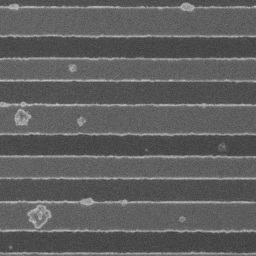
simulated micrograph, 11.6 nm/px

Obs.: lines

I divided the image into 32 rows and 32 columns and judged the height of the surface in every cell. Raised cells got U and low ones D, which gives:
DDDDDDDDDDDDDDDDDDDDDDDUDDDDDDDD
UUUUUUUUUUUUUUUUUUUUUUUUUUUUUUUU
UUUUUUUUUUUUUUUUUUUUUUUUUUUUUUUU
UUUUUUUUUUUUUUUUUUUUUUUUUUUUUUUU
UUDUDDDDDDDUUDUUUUDDDDUUDUUUUUUU
DDDDDDDDDDDDDDDDDDDDDDDDDDDDDDDD
DDDDDDDDDDDDDDDDDDDDDDDDDDDDDDDD
UUUUUUUUUUUUUUUUUUUUUUUUUUUUUUUU
UUUUUUUUUUUUUUUUUUUUUUUUUUUUUUUU
UUUUUUUUUUUUUUUUUUUUUUUUUUUUUUUU
DDDDDDDDDDDDDDDDDDDDDDDDDDDDDDDD
DDDDDDDDDDDDDDDDDDDDDDDDDDDDDDDD
DDDDDDDDDDDDDDDDDDDDDDDDDDDDDDDD
UUUUUUUUUUUUUUUUUUUUUUUUUUUUUUUU
UUUUUUUUUUUUUUUUUUUUUUUUUUUUUUUU
UUUUUUUUUUUUUUUUUUUUUUUUUUUUUUUU
UUUUUUUUUUUUUUUUUUUUUUUUUUUUUUUU
DDDDDDDDDDDDDDDDDDDDDDDDDDDDDDDD
DDDDDDDDDDDDDDDDDDDDDDDDDDDDDDDD
UUDUDUDDUUUDDUDDDDDDDDDDDDDDDDDD
UUUUUUUUUUUUUUUUUUUUUUUUUUUUUUUU
UUUUUUUUUUUUUUUUUUUUUUUUUUUUUUUU
DDDDDDDDDDDDDDDDDDDDDDDDDDDDDDDD
DDDDDDDDDDDDDDDDDDDDDDDDDDDDDDDD
DDDDDDDDDDDDDDDDDDDDDDDDDDDDDDDD
UUUUUUUUUUUUUUUUUUUUUUUUUUUUUUUU
UUUUUUUUUUUUUUUUUUUUUUUUUUUUUUUU
UUUUUUUUUUUUUUUUUUUUUUUUUUUUUUUU
UUUUUUUUUUUUUUUUUUUUUUUUUUUUUUUU
DDDDDDDDDDDDDDDDDDDDDDDDDDDDDDDD
DDDDDDDDDDDDDDDDDDDDDDDDDDDDDDDD
DDDDDDDDDDDDDDDDDDDDDDDDDDDDDDDD